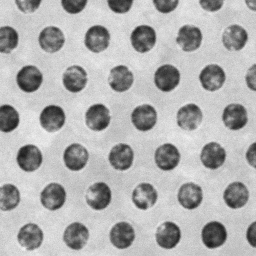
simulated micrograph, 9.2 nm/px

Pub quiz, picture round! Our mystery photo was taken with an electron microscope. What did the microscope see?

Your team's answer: a regular array of holes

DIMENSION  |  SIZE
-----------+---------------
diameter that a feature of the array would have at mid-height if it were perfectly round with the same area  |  253 nanometres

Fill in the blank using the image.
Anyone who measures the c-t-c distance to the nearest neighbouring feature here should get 415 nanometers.